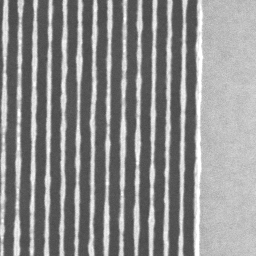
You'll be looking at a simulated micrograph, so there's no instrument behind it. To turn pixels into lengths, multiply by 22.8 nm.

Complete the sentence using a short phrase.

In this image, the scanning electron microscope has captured parallel lines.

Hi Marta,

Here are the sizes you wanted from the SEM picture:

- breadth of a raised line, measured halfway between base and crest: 3.63 px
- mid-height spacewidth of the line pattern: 253 nanometers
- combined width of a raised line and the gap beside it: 340 nm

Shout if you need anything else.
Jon